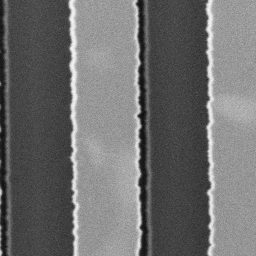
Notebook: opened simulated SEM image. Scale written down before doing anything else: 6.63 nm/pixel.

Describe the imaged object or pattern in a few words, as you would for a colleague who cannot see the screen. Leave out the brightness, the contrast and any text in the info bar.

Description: lines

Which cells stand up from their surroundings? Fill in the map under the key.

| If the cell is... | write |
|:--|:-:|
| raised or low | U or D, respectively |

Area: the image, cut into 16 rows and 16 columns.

DDDDUUUUUDDDDUUU
DDDDUUUUUDDDDUUU
DDDDUUUUUDDDDUUU
DDDDUUUUUDDDDUUU
DDDDUUUUUDDDDUUU
DDDDUUUUUDDDDUUU
DDDDDUUUUDDDDUUU
DDDDDUUUUDDDDUUU
DDDDDUUUUDDDDUUU
DDDDDUUUUDDDDUUU
DDDDDUUUUDDDDUUU
DDDDDUUUUDDDDUUU
DDDDDUUUUDDDDUUU
DDDDDUUUUDDDDUUU
DDDDDUUUUDDDDUUU
DDDDDUUUUDDDDUUU